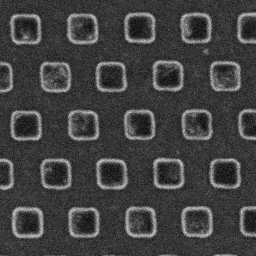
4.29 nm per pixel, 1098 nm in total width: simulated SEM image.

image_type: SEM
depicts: a regular array of raised bodies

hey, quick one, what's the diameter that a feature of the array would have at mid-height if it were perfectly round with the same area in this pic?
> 133 nm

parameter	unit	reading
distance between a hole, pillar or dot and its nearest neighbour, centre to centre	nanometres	239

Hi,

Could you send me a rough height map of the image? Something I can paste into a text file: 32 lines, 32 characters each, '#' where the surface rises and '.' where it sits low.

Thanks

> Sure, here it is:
................................
................................
.####....###....###....###....##
.####....###....###....###....##
..###....###....###....###....##
................................
................................
................................
#....####...####...####...####..
#....####...####...####...####..
##...####...####...####...####..
................................
................................
................................
..###....###....###....###....##
..###....###....###....###....##
..###....###....###....###....##
................................
................................
................................
#....####...###....####....###..
#....####...####...####...####..
#....####...####...####...####..
#...............................
................................
................................
..###....###....###....###....##
..###....###....###....###....##
..###....###....###....###....##
..###............#..............
................................
................................